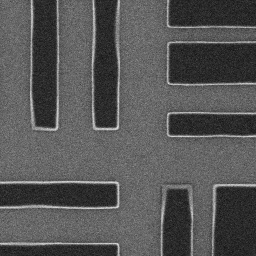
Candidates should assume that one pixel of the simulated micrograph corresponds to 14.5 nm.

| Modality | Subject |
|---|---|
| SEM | groups of lines, slits or small figures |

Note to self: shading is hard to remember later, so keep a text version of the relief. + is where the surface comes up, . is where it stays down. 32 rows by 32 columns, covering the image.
....+++.....+++......+++++++++++
....+++.....+++......+++++++++++
....+++.....+++......+++++++++++
....+++.....+++.................
....+++.....+++.................
....+++.....+++......+++++++++++
....+++.....+++......+++++++++++
....+++.....+++......+++++++++++
....+++.....+++......+++++++++++
....+++.....+++......+++++++++++
....+++.....+++......++++++.....
....+++.....+++.................
....+++.....+++.................
....+++.....+++.................
....+++.....+++......+++++++++++
....+++.....+++......+++++++++++
.....................+++++++++++
................................
................................
................................
................................
................................
................................
+++++++++++++++......+++...+++++
+++++++++++++++.....++++...+++++
+++++++++++++++.....++++...+++++
....................++++...+++++
....................++++...+++++
....................++++...+++++
....................++++...+++++
++...+++++++++......++++...+++++
+++++++++++++++.....++++...+++++